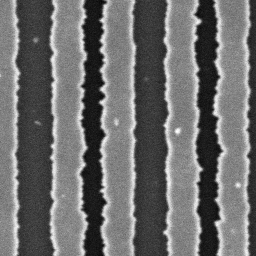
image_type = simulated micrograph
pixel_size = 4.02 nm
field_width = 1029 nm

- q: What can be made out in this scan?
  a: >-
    lines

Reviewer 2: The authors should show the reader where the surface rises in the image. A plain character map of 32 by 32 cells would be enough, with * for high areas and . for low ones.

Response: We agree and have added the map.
**.....***...****....****..****.
**.....****..****....***...****.
**.....****..****....****..****.
**....****...****....***...****.
**....****...****....***...****.
**....****...****....***...****.
**.....****..****....***...****.
**....*****..****....***...****.
**.....***...****....****..****.
**.....****..****....****..****.
**.....***...****....****..****.
**.....***...****....****..****.
**....****...****....****..****.
**.....***...****....****..****.
**.....***...****....****..****.
**.....***...****....****..****.
**.....***...****....****..****.
**.....****..****....***...****.
**.....****..****....***....***.
**....****...****....****..****.
**.....***...****....****..****.
**.....***...****....****..****.
**.....***...****....****..****.
**.....***...****....****..****.
**....****...****....****..****.
**.....***...****....****..****.
**....****...****....****..****.
**....*****..****....****..****.
**....*****..****....****..****.
**....*****..****....****..****.
**.....***...****....****..****.
**.....****..****....****..****.